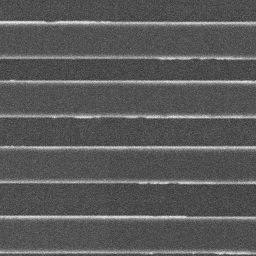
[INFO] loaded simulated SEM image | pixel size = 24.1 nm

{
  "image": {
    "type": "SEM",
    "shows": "lines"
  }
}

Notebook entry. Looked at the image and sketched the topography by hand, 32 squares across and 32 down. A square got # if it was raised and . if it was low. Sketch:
................................
................................
................................
################################
################################
################################
################################
................................
................................
................................
################################
################################
################################
################################
################################
................................
................................
................................
################################
################################
################################
################################
################################
................................
................................
................................
................................
################################
################################
################################
################################
################################